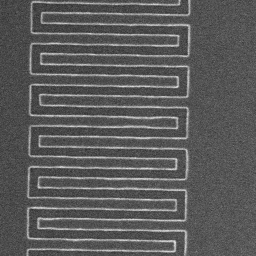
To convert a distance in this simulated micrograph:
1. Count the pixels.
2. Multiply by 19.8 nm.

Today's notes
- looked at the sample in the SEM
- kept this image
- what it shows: groups of lines, slits or small figures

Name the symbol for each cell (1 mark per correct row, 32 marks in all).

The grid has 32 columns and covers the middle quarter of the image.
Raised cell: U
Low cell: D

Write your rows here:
DDDDDDDDDDDDDDDDDDDDDUUDUUUUUUUU
DDDDDDDDDDDDDDDDDDDDDDDDDDDDDDDU
DDDDDDDDDDDDDDDDDDDDDDDDDDDDDDDU
UUUUUUUUUUUUUUUUUUUUUUUUUUUUDDDU
UUUUUUUUUUUUUUUUUUUUUUUUUUUUDDDU
DDDDDDDDUUDDUUUUUUUUUUUUUUUUDDDU
DDDDDDDDDDDDDDDDDDDDDDDDDDDDDDDU
DDDDDDDDDDDDDDDDDDDDDDDDDDDDDDDU
UUUUUUUUUUUUUUUUUUUUUUUUUUUUUUUU
UUUUUUUUUUUUUUUUUUUUUUUUUUUUUUUU
DDUUUUUUUUUUUUUUUUUUUUUUUUUUUUUU
DDDDDDDDDDDDDDDDDDDDDDDDDDDDDDDU
DDDDDDDDDDDDDDDDDDDDDDDDDDDDDDDU
UUUUUUUUUUUUUUUUUUUUDDUUUUUUDDDU
UUUUUUUUUUUUUUUUUUUUUUUUUUUUDDDU
UUUUUUUUUUUUUUUUUUUUUUUUUUUUDDDU
DDDDDDDDDDDDDDDDDDDDDDDDDDDDDDDU
DDDDDDDDDDDDDDDDDDDDDDDDDDDDDDDU
UUUUUUUUUUUUUUUUUUDDDDUUUDDDDDUU
UUUUUUUUUUUUUUUUUUUUUUUUUUUUUUUU
UUUUUUUUUUUUUUUUUUUUUUUUUUUUUUUU
DDDDDDDDDDDDDDDDDDDDDDDDDDDDDDUU
DDDDDDDDDDDDDDDDDDDDDDDDDDDDDDDU
UUUUUUUUUUUUUDDDDDDDDDDDDDDDDDDU
UUUUUUUUUUUUUUUUUUUUUUUUUUUUDDDU
UUUUUUUUUUUUUUUUUUUUUUUUUUUUDDDU
DDDDDDDDDDDDDDDDDDDDDDDDDDDDDDDU
DDDDDDDDDDDDDDDDDDDDDDDDDDDDDDDU
UUDDDDDDDDDDDDDDDDDDDDDDDDDDDDUU
UUUUUUUUUUUUUUUUUUUUUUUUUUUUUUUU
UUUUUUUUUUUUUUUUUUUUUUUUUUUUUUUU
DDDDDDDDDDDDDDDDDDDDDDDDUUUUUUUU